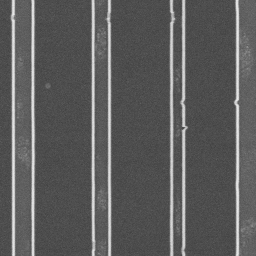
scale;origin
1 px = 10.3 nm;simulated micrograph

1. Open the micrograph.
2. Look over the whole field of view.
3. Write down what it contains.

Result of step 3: one or a few lines or trenches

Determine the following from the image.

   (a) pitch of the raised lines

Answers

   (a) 760 nm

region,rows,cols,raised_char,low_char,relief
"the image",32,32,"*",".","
**..********..*******..*******..
**..********..********.*******..
**..********..********.*******..
**..********..*******..*******..
**..********..*******..*******..
**..********..*******..*******..
**..********..*******..*******..
**..********..*******..*******..
**..********..*******..*******..
**..********..*******..*******..
**..********..*******..*******..
**..********..*******..*******..
**..********..*******..*******..
**..********..*******..*******..
**..********..*******..*******..
**..********..*******..*******..
**..********..*******..*******..
**..********..*******..*******..
**..********..*******..*******..
**..********..*******..*******..
**..********..*******..*******..
**..********..*******..*******..
**..********..*******..*******..
**..********..*******..*******..
**..********..*******..*******..
**..********..*******..*******..
**..********..*******..*******..
**..********..*******..*******..
**..********..*******..*******..
**..********..*******..*******..
**..********..*******..*******..
**..********..*******..*******..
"